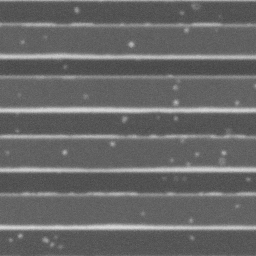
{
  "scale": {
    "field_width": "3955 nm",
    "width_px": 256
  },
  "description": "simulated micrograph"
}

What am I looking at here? lines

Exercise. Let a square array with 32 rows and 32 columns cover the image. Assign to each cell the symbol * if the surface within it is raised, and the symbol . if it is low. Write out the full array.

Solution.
................................
................................
................................
********************************
********************************
********************************
********************************
................................
................................
................................
********************************
********************************
********************************
********************************
................................
................................
................................
********************************
********************************
********************************
********************************
................................
................................
................................
********************************
********************************
********************************
********************************
.......................****...*.
................................
................................
................................